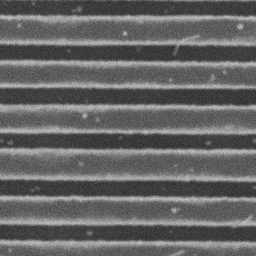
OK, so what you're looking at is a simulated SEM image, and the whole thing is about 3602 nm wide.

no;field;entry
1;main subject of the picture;lines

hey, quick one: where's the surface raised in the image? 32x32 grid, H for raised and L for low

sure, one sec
LLLLLLLLLLLLLLLLLLLLLLLLLLLLLLLL
LLLLLLLLLLLLLLLLLLLLLLLLLLLLLLLL
HHHHHHHHHHHHHHHHHHHHHHHHHHHHHHHH
HHHHHHHHHHHHHHHHHHHHHHHHHHHHHHHH
HHHHHHHHHHHHHHHHHHHHHHHHHHHHHHHH
LLLLLLLLLLLHLLHHHHHHHHHHHHHHHHLL
LLLLLLLLLLLLLLLLLLLLLLLLLLLLLLLL
LLLLLLLLLLLLLLLLLLLLLLLLLLLLLLLL
HHHHHHHHHHHHHHHHHHHHHHHHHHHHHHHH
HHHHHHHHHHHHHHHHHHHHHHHHHHHHHHHH
HHHHHHHHHHHHHHHHHHHHHHHHHHHHHHHH
LLLLLLLLLLLLLLLLLLLLLLLLLLLLLLLL
LLLLLLLLLLLLLLLLLLLLLLLLLLLLLLLL
HHHHHHHHHHHHHHHHHHHHHHHHHHHHHHHH
HHHHHHHHHHHHHHHHHHHHHHHHHHHHHHHH
HHHHHHHHHHHHHHHHHHHHHHHHHHHHHHHH
LLLLLLLLLHHHHHHHHHHHHHHHHHHHLHHH
LLLLLLLLLLLLLLLLLLLLLLLLLLLLLLLL
LLLLLLLLLLLLLLLLLLLLLLLLLLLLLLLL
HHHHHHHHHHHHHHHHHHHHHHHHHHHHHHHH
HHHHHHHHHHHHHHHHHHHHHHHHHHHHHHHH
HHHHHHHHHHHHHHHHHHHHHHHHHHHHHHHH
LLLLLLLLLLLLLLLLLLLLLLLLLLLLLLLL
LLLLLLLLLLLLLLLLLLLLLLLLLLLLLLLL
LLLLLLLLLLLLLLLLLLLLLLLLLLLLLLLL
HHHHHHHHHHHHHHHHHHHHHHHHHHHHHHHH
HHHHHHHHHHHHHHHHHHHHHHHHHHHHHHHH
HHHHHHHHHHHHHHHHHHHHHHHHHHHHHHHH
LLLLLLLLLLLLLLLLLLLLLLLLLLLLLLLL
LLLLLLLLLLLLLLLLLLLLLLLLLLLLLLLL
HHHHHHHHHHHHHHHHHHHHHHHHHHHHHHHH
HHHHHHHHHHHHHHHHHHHHHHHHHHHHHHHH